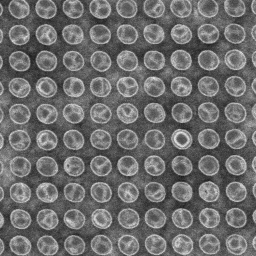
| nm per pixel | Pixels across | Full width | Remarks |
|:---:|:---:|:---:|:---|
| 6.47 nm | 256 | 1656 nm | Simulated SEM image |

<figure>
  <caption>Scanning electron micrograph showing a regular array of raised bodies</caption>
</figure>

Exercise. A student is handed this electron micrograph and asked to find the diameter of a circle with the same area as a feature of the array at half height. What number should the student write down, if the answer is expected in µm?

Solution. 0.13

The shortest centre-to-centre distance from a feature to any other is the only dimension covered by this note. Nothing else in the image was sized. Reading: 0.169 microns